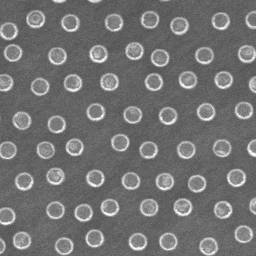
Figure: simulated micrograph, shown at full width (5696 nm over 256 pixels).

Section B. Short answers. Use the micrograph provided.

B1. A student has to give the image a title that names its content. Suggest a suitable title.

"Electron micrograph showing a regular array of raised bodies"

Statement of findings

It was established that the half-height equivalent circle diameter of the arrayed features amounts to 386 nanometres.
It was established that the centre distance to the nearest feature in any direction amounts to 680 nanometers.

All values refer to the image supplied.